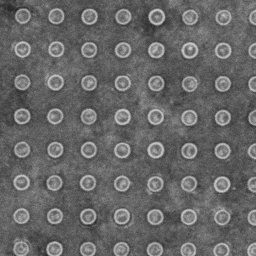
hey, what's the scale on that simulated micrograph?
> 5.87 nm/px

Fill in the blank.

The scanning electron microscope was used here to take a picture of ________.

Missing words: a regular array of raised bodies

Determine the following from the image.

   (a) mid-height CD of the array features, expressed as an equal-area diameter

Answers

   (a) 84.6 nanometers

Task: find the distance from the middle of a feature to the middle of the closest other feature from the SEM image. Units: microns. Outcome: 0.194